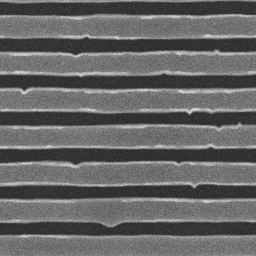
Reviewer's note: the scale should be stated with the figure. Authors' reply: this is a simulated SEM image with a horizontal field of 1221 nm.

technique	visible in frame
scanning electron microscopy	parallel lines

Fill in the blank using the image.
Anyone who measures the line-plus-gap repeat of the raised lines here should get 175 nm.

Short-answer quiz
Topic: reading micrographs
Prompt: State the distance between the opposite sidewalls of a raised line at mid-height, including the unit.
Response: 113 nanometres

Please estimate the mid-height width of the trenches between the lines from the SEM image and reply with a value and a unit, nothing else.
62.6 nanometers